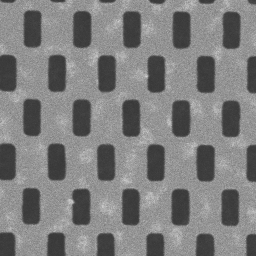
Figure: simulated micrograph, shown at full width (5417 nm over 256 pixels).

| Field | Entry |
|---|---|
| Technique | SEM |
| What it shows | a regular array of holes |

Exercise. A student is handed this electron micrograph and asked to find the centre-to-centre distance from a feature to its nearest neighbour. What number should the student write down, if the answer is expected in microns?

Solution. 1.05